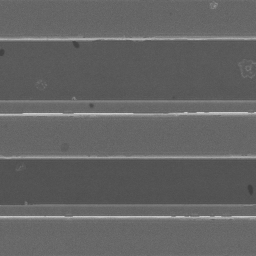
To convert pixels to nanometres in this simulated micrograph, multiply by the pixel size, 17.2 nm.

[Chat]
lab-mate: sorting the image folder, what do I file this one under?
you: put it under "lines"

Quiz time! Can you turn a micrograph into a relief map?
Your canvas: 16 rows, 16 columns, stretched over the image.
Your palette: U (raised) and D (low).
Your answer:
UUUUUUUUUUUUUUUU
UUUUUUUUUUUUUUUU
DDDDDDDDDDDDDDDD
DDDDDDDDDDDDDDDD
DDDDDDDDDDDDDDDD
DDDDDDDDDDDDDDDD
UUUUUUUUUUUUUUUU
UUUUUUUUUUUUUUUU
UUUUUUUUUUUUUUUU
UUUUUUUUUUUUUUUU
DDDDDDDDDDDDDDDD
DDDDDDDDDDDDDDDD
DDDDDDDDDDDDDDDD
UUUUUUUUUUUUUUUU
UUUUUUUUUUUUUUUU
UUUUUUUUUUUUUUUU